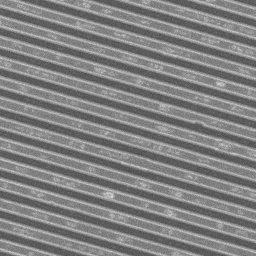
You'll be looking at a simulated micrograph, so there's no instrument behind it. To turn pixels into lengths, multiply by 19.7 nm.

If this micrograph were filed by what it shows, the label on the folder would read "parallel lines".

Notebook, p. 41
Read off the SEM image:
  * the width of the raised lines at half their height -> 192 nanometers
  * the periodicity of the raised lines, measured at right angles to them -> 0.384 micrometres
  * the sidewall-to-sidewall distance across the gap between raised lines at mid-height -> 0.192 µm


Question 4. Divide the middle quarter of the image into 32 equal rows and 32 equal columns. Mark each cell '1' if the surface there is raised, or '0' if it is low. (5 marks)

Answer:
01111111110000000001111111100000
00001111111110000000001111111110
00000000111111111000000000111111
11100000000111111111000000000111
11111100000000011111111100000000
01111111100000000011111111100000
00001111111110000000001111111110
00000000111111110000000001111111
11000000000111111111000000000111
11111100000000011111111000000000
01111111100000000011111111100000
00001111111110000000001111111100
00000000111111110000000001111111
11000000000111111111000000000111
11111100000000011111111000000000
11111111100000000011111111100000
00001111111110000000001111111100
00000001111111110000000001111111
11000000000111111111000000000111
11111000000000111111111000000000
11111111100000000011111111100000
00001111111100000000011111111100
00000001111111111000000001111111
11000000000111111111000000001111
11111000000000111111111000000000
11111111100000000111111111000000
00011111111100000000011111111100
00000001111111110000000001111111
10000000001111111110000000001111
11111000000000111111111000000000
11111111000000000111111111000000
00011111111100000000011111111100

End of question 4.